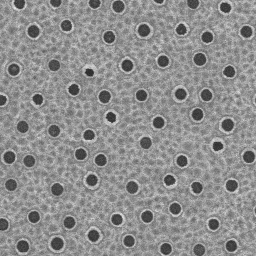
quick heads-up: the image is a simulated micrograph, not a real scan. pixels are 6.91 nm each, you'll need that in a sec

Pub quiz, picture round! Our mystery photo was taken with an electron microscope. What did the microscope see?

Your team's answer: a regular array of holes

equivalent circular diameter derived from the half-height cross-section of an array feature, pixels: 12.3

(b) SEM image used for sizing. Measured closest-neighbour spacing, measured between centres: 193 nanometers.